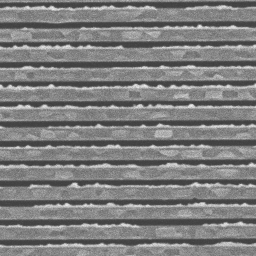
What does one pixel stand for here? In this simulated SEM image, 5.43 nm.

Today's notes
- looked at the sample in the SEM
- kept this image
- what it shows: parallel lines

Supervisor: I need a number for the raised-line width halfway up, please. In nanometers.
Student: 80.7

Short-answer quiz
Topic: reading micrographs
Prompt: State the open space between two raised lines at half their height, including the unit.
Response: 0.0285 microns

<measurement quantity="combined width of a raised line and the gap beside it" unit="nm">107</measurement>